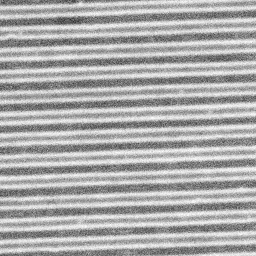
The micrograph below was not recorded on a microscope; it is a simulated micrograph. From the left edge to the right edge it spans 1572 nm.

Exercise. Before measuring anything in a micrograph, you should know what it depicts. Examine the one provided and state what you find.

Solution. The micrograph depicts parallel lines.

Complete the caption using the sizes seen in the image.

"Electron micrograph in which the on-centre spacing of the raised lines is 21.3 px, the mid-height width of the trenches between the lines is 68.2 nanometres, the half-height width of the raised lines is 62.9 nm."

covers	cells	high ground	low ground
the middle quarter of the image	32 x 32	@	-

------------------@@@--@@@@@@@@@
@@@@@@@@@@@@@@@@@@@@@@@@@@@@@@@@
@@@@@@@@@@@@@@@@@@@@@@@@@@@@@@@@
@@@@----------------------------
--------------------------------
---------------------------@@---
----@@@@@@@@@@@@@@@@@@@@@@@@@@@@
@@@@@@@@@@@@@@@@@@@@@@@@@@@@@@@@
@@@@@@@@@@@@@@------------------
--------------------------------
--------------------------------
-------@@@@@-@@@@@@@@@@@@@@@@@@@
@@@@@@@@@@@@@@@@@@@@@@@@@@@@@@@@
@@@@@@@@@@@@@@@@@@@@@@@@@@@@----
--------------------------------
--------------------------------
----------------------@@@@@@@@@@
@@@@@@@@@@@@@@@@@@@@@@@@@@@@@@@@
@@@@@@@@@@@@@@@@@@@@@@@@@@@@@@@@
@@@----@@-----------------------
--------------------------------
-------------------------------@
---@@@@@@@@@@@@@@@@@@@@@@@@@@@@@
@@@@@@@@@@@@@@@@@@@@@@@@@@@@@@@@
@@@@@@@@@@@@--------------------
--------------------------------
--------------------------------
------------@@@@@@@@@@@@@@@@@@@@
@@@@@@@@@@@@@@@@@@@@@@@@@@@@@@@@
@@@@@@@@@@@@@@@@@@@@@-----------
--------------------------------
--------------------------------